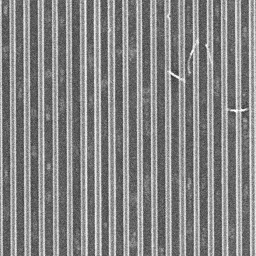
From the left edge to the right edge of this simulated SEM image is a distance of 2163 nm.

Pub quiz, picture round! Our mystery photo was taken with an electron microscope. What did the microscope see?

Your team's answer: parallel lines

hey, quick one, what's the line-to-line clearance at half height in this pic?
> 72.9 nanometers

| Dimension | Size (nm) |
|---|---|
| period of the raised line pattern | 119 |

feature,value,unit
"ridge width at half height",43.3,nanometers